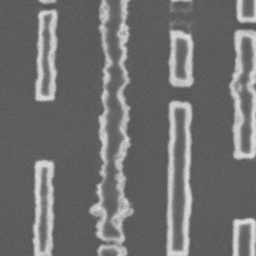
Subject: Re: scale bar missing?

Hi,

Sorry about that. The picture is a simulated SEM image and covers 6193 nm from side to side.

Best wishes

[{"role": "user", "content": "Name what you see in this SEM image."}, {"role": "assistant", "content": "one or a few lines or trenches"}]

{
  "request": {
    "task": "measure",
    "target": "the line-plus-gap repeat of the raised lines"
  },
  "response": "1610 nanometers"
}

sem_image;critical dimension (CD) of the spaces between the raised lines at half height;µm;1.16